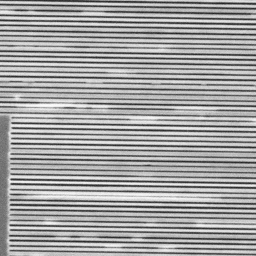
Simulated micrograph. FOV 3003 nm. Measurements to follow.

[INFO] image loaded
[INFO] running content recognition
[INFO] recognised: parallel lines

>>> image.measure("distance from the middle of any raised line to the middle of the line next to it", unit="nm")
60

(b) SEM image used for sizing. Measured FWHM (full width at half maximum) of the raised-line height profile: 41 nm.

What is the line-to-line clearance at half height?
20.5 nm